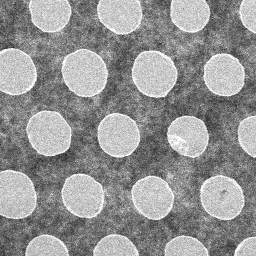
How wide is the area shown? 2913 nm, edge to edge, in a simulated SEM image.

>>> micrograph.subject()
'a regular array of raised bodies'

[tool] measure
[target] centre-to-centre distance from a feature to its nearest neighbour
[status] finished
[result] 791 nm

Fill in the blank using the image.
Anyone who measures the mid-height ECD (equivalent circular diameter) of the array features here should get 475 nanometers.